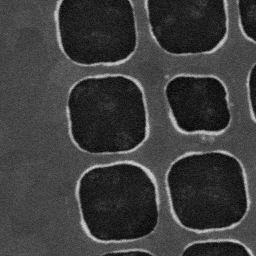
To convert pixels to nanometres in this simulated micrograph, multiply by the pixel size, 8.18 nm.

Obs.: holes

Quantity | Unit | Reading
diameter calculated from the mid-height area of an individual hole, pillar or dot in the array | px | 81.9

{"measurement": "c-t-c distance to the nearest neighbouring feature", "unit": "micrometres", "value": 0.718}